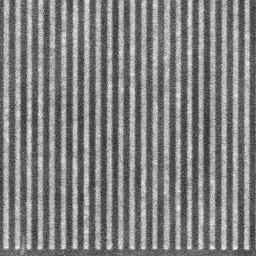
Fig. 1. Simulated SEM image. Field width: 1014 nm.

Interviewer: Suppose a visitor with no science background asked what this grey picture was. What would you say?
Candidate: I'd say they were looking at parallel lines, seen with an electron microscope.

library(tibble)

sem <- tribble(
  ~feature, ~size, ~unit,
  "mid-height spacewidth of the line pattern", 28.7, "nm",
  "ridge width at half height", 0.0178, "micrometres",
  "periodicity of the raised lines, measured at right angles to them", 0.0454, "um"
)